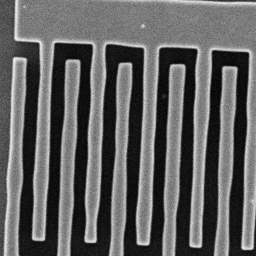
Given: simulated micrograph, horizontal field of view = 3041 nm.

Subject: groups of lines, slits or small figures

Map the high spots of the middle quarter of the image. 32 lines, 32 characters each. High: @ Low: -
-@@@---@@@----@@@---@@@----@@@--
-@@@---@@@----@@@---@@@----@@@--
-@@@---@@@---@@@@---@@@----@@@--
-@@@---@@@---@@@@---@@@----@@@--
@@@@---@@@---@@@@---@@@----@@@--
@@@@---@@@---@@@@---@@@----@@@--
@@@@---@@@---@@@@---@@@---@@@@--
@@@@---@@@---@@@@---@@@---@@@@--
@@@----@@@---@@@----@@@---@@@@--
@@@----@@@---@@@----@@@---@@@@--
@@@----@@@---@@@----@@@---@@@@--
@@@----@@@---@@@----@@@---@@@@--
@@@----@@@---@@@----@@@---@@@@--
@@@---@@@@---@@@----@@@---@@@@--
@@@---@@@@---@@@----@@@---@@@---
@@@---@@@@---@@@----@@@---@@@---
@@@---@@@@---@@@----@@@---@@@---
@@@---@@@----@@@----@@@---@@@---
@@@---@@@----@@@----@@@---@@@---
@@@---@@@----@@@----@@----@@@---
@@@---@@@----@@@---@@@----@@@---
@@@---@@@----@@@---@@@----@@@---
@@@---@@@----@@@---@@@----@@@---
@@@---@@@----@@@---@@@----@@@---
@@----@@@----@@----@@@----@@@---
@@----@@@----@@----@@@----@@@---
@@----@@@----@@@---@@@---@@@@---
@@----@@@----@@@---@@@---@@@@---
@@----@@@----@@@---@@@---@@@@---
@@----@@@---@@@@---@@@---@@@@---
@@----@@@---@@@@---@@@---@@@@---
@@----@@@---@@@@---@@@---@@@@---